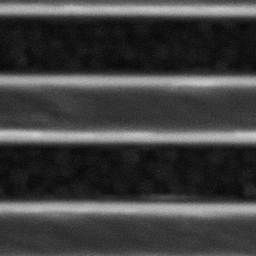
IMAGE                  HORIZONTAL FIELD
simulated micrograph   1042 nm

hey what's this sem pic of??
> one or a few lines or trenches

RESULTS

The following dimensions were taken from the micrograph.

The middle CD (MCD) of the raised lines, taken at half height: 239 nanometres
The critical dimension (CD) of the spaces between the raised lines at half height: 0.278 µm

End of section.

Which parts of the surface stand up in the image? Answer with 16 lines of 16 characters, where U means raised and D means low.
UUUUUUUUUUUUUUUU
DDDDDDDDDDDDDDDD
DDDDDDDDDDDDDDDD
DDDDDDDDDDDDDDDD
DDDDDDDDDDDDDDDD
UUUUUUUUUUUUUUUU
UUUUUUUUUUUUUUUU
UUUUUUUUUUUUUUUU
UUUUUUUUUUUUUUUU
DDDDDDDDDDDDDDDD
DDDDDDDDDDDDDDDD
DDDDDDDDDDDDDDDD
DDDDDDDDDDDDDDDD
UUUUUUUUUUUUUUUU
UUUUUUUUUUUUUUUU
UUUUUUUUUUUUUUUU